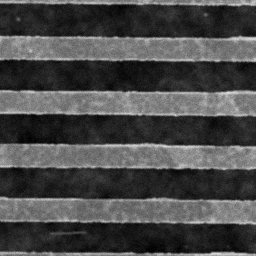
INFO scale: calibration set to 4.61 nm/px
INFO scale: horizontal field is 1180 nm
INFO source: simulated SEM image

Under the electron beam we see lines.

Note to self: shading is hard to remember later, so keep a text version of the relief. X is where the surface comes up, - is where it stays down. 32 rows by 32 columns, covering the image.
--------------------XX-XXXXXXXXX
--------------------------------
--------------------------------
--------------------------------
--------------------------------
XXXXXXXXXXXXXXXXXXXXXXXXXXXXXXXX
XXXXXXXXXXXXXXXXXXXXXXXXXXXXXXXX
--------------X-----XXXXXXXXXXXX
--------------------------------
--------------------------------
--------------------------------
XXXXXXXXXXXX-X------------------
XXXXXXXXXXXXXXXXXXXXXXXXXXXXXXXX
XXXXXXXXXXXXXXXXXXXXXXXXXXXXXXXX
--------------------------------
--------------------------------
--------------------------------
--------------------------------
XXXXXXXXXXXXXXXXXXXXXXXXXXXXXXXX
XXXXXXXXXXXXXXXXXXXXXXXXXXXXXXXX
XXXXXXXXXXXXXXXXXXXXXXXXXXXXXXXX
--------------------------------
--------------------------------
--------------------------------
--------------------------------
XXXXXXXXXXXXXXXXXXXXXXXXXXXXXXXX
XXXXXXXXXXXXXXXXXXXXXXXXXXXXXXXX
XXXXXXXXXXXXXXXXXXXXXXXXXXXXXXXX
--------------------------------
--------------------------------
--------------------------------
--------------------------------